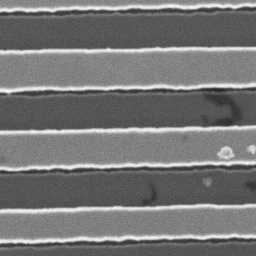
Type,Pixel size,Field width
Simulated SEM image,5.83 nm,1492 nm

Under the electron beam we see lines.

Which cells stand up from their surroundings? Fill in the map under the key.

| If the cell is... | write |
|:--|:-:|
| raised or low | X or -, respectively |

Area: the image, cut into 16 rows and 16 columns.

XXXXXXXXXX-X----
----------------
----------------
XXXXXXXXXXXXXXXX
XXXXXXXXXXXXXXXX
XXXXXXXXXXXXX---
----------------
----------------
XXXXXXXXXXXXXXXX
XXXXXXXXXXXXXXXX
XXXXX-----------
----------------
----------------
XXXXXXXXXXXXXXXX
XXXXXXXXXXXXXXXX
----------------